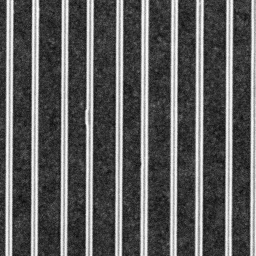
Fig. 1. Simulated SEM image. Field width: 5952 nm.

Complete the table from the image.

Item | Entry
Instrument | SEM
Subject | parallel lines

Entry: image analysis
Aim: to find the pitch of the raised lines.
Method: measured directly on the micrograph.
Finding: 638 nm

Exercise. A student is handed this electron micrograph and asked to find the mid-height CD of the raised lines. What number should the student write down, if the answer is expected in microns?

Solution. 0.107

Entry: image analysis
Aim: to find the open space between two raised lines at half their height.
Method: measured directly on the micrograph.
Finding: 494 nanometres